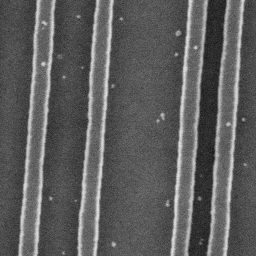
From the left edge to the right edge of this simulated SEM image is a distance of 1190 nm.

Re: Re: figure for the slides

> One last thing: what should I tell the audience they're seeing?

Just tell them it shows lines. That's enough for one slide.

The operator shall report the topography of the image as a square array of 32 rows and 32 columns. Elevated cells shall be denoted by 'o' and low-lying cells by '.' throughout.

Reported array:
.....oo.....oo..........oo..ooo.
.....oo.....oo..........oo..oo..
.....oo.....oo..........oo..oo..
....ooo.....oo.........ooo..oo..
....ooo.....oo.........ooo..oo..
....ooo.....oo.........ooo..oo..
....ooo.....oo.........oo...oo..
....oo.....ooo.........oo...oo..
....oo.....ooo.........oo...oo..
....oo.....ooo.........oo..ooo..
....oo.....oo..........oo..ooo..
....oo.....oo..........oo..ooo..
....oo.....oo..........oo..ooo..
....oo.....oo..........oo..ooo..
....oo.....oo..........oo..oo...
....oo.....oo..........oo..oo...
....oo.....oo.........ooo..oo...
...ooo.....oo.........ooo..oo...
...oo......oo.........oo...oo...
...oo......oo.........oo...oo...
...oo......oo.........oo...oo...
...oo.....ooo.........oo...oo...
...oo.....ooo.........oo...oo...
...oo.....ooo.........oo...oo...
...oo.....oo..........oo...oo...
...oo.....oo..........oo..ooo...
...oo.....oo..........oo..ooo...
...oo.....oo..........oo..ooo...
...oo.....oo..........oo..ooo...
...oo.....oo..........oo..oo....
..ooo.....oo..........oo..oo....
..ooo.....oo.........oo...oo....